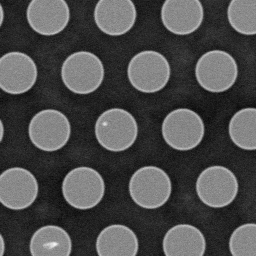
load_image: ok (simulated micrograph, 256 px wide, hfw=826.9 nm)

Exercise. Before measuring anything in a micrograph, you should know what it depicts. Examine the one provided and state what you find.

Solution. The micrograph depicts an array of small figures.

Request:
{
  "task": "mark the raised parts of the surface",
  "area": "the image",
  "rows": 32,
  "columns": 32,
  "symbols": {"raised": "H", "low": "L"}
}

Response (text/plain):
LLLLHHHHLLLLHHHHHLLLHHHHHLLLLHHH
LLLHHHHHHLLLHHHHHLLLHHHHHLLLHHHH
LLLLHHHHHLLLHHHHHLLLHHHHHLLLLHHH
LLLLHHHHLLLLLHHHLLLLLHHHHLLLLHHH
LLLLLLLLLLLLLLLLLLLLLLLLLLLLLLLL
LLLLLLLLLLLLLLLLLLLLLLLLLLLLLLLL
LLLLLLLLLLHLLLLLLLHLLLLLLLHHLLLL
HHHHLLLLHHHHLLLLHHHHHLLLLHHHHLLL
HHHHLLLLHHHHHLLLHHHHHLLLHHHHHHLL
HHHHHLLLHHHHHLLLHHHHHLLLLHHHHHLL
HHHHLLLLHHHHHLLLLHHHHLLLLHHHHLLL
LHHLLLLLLHHLLLLLLLHLLLLLLLLLLLLL
LLLLLLLLLLLLLLLLLLLLLLLLLLLLLLLL
LLLLLLLLLLLLLLLLLLLLLLLLLLLLLLLL
LLLLHHHHLLLLHHHHLLLLLHHHHLLLLHHH
LLLLHHHHHLLLHHHHHLLLHHHHHLLLLHHH
LLLLHHHHHLLLHHHHHLLLHHHHHLLLLHHH
LLLLHHHHLLLLHHHHHLLLLHHHHLLLLHHH
LLLLLHHLLLLLLHHHLLLLLLHHLLLLLLHH
LLLLLLLLLLLLLLLLLLLLLLLLLLLLLLLL
LLLLLLLLLLLLLLLLLLLLLLLLLLLLLLLL
LHHHLLLLLHHHLLLLLHHHHLLLLHHHHLLL
HHHHLLLLHHHHHLLLHHHHHLLLLHHHHLLL
HHHHHLLLHHHHHLLLHHHHHLLLLHHHHHLL
HHHHLLLLHHHHHLLLHHHHHLLLLHHHHLLL
HHHHLLLLLHHHLLLLLHHHLLLLLLHHLLLL
LLLLLLLLLLLLLLLLLLLLLLLLLLLLLLLL
LLLLLLLLLLLLLLLLLLLLLLLLLLLLLLLL
LLLLLHHHLLLLLHHHLLLLLLHHLLLLLLHH
LLLLHHHHHLLLHHHHHLLLLHHHHLLLLHHH
LLLLHHHHHLLLHHHHHLLLHHHHHHLLLHHH
LLLLHHHHHLLLHHHHHLLLLHHHHHLLLHHH